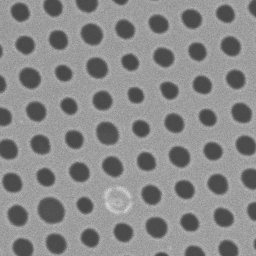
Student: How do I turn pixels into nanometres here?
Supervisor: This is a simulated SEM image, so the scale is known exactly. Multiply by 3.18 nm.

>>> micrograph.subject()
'a regular array of holes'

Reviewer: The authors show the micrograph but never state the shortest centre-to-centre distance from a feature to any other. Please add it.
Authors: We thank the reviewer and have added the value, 106 nm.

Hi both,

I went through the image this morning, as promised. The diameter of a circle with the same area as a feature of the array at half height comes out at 0.0579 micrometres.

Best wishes